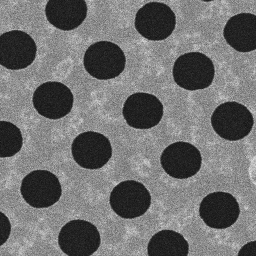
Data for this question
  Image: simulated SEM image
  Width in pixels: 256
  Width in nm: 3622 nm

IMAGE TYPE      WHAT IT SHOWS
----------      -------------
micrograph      a regular array of holes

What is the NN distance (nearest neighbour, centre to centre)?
890 nanometers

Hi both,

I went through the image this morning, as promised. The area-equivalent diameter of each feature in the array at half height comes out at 0.567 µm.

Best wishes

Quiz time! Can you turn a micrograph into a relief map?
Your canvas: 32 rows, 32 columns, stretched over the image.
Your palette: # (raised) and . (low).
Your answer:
######.....#######...###########
######.....######.....##########
######.....######.....#######...
#######...#######.....######....
....##############...#######....
....########..###############...
.....######....#########.#####.#
....######......######....######
#..########.....######.....#####
###########....#######.....#####
#####...##############....######
####.....#######################
####.....#######....############
####.....######.....#######....#
#####...#######.....######......
..##############....######......
...########.###############....#
...######.....##############..##
...######.....#######....#######
..#######.....######.....#######
##########...#######.....#######
####..###############....#######
###....#########.###############
###.....######....##############
###.....######.....#######...###
####...#######.....######.....##
##############....#######.....##
.########.###############.....##
.#######....###############.####
.######......######....#########
#######......#####......#######.
########....######......######..